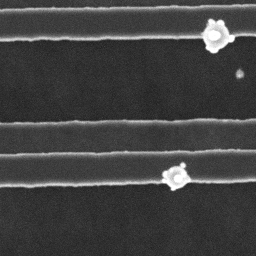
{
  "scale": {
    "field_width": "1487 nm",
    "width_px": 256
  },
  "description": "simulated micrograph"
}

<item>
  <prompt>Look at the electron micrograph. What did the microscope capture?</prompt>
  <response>lines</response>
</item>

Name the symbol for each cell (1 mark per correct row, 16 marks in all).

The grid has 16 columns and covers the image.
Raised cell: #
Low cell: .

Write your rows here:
################
################
.............##.
................
................
................
................
.............#.#
################
################
################
#######...##....
................
................
................
................